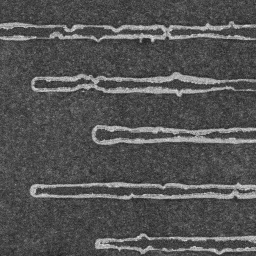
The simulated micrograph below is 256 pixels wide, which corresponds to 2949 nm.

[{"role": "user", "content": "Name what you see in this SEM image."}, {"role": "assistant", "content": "parallel lines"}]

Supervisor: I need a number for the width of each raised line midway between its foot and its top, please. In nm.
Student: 143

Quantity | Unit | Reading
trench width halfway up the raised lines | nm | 464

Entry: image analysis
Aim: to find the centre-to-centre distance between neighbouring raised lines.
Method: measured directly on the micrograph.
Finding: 0.61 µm